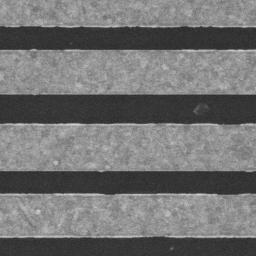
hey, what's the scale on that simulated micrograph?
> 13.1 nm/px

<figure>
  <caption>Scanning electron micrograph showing lines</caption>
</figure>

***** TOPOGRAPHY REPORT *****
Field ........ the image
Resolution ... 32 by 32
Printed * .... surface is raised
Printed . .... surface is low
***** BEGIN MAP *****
********************************
********************************
********************************
................................
................................
................................
********************************
********************************
********************************
********************************
********************************
********************************
................................
................................
................................
................................
********************************
********************************
********************************
********************************
********************************
................................
................................
................................
********************************
********************************
********************************
********************************
********************************
******************..************
................................
................................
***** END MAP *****